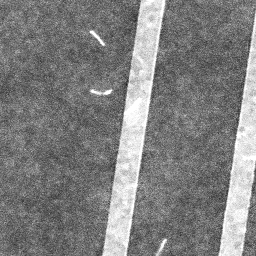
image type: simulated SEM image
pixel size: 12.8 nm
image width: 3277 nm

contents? one or a few lines or trenches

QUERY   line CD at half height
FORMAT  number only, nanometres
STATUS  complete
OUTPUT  290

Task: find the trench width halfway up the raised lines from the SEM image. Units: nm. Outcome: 1180